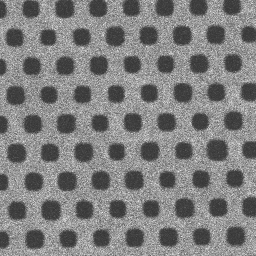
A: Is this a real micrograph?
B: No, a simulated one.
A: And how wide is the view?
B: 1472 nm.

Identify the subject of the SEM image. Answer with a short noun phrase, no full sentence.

a regular array of holes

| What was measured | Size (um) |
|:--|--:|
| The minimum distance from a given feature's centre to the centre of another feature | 0.191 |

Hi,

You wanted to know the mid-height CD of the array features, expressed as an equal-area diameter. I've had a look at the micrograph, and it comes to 108 nanometers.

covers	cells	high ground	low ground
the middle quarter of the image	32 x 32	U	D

DDDUUUDDDDDUUUUDDDDUUUUDDDDDUUUD
DDUUUUUDDDDUUUUDDDDUUUUUDDDUUUUU
DDUUUUUUDDUUUUUUUDUUUUUUUUUUUUUU
UUUUUUUUUUUUUUUUUUUUUUUUUUUUUUUU
UUUUUUUUUUUUUUUUUUUUUUUUUUUUUUUU
UUUUDUUUUUUUDDUUUUUUDDDUUUUUDDDD
UUUDDDDUUUUDDDDUUUUDDDDUUUUDDDDD
UUDDDDDUUUUDDDDUUUUDDDDDUUUDDDDD
UUUDDDDUUUUDDDDUUUUUDDDUUUUUDDDD
UUUDDDUUUUUUDDUUUUUUDDUUUUUUUDDU
UUUUUUUUUUUUUUUUUUUUUUUUUUUUUUUU
UUUUUUUUUUUUUUUUUUUUUUUUUUUUUUUU
UUUUUUUUUUUUUUUUDDUUUUUUDDDUUUUU
DDDUUUUDDDDUUUUDDDDUUUUDDDDDUUUU
DDDUUUUDDDDUUUUDDDDDUUUDDDDDUUUU
DDDUUUUDDDDUUUUDDDDUUUUDDDDDUUUU
DDDUUUUUDDDUUUUUDDDUUUUUDDDUUUUU
UUUUUUUUUUUUUUUUUUUUUUUUUUUUUUUU
UUUUUUUUUUUUUUUUUUUUUUUUUUUUUUUU
UUUUUUUUUUUUUUUUUUUUUDUUUUUUUDDU
UUUDDDDUUUUUDDDUUUUDDDDDUUUUDDDD
UUUDDDDUUUUDDDDUUUUDDDDDUUUUDDDD
UUUDDDDUUUUDDDDUUUUDDDDDUUUUDDDD
UUUDDDDUUUUUDDDUUUUUDDDUUUUUDDDU
UUUUUUUUUUUUUUUUUUUUUUUUUUUUUUUU
UUUUUUUUUUUUUUUUUUUUUUUUUUUUUUUU
UUUUUUUUUUUUUUUUUUUUUUUUUUUUUUUU
DDDUUUUDDDDUUUUDDDDDUUUUDDDDUUUU
DDDUUUUDDDDDUUUDDDDDUUUUDDDDUUUU
DDDUUUUDDDDDUUUDDDDDUUUUDDDDUUUU
DDDUUUUDDDDUUUUUDDDDUUUUDDDUUUUU
DDUUUUUUUDUUUUUUUDUUUUUUUUUUUUUU